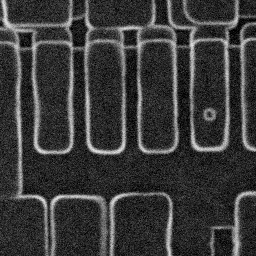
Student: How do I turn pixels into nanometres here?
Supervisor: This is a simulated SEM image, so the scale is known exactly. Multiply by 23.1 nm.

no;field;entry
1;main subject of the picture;wiring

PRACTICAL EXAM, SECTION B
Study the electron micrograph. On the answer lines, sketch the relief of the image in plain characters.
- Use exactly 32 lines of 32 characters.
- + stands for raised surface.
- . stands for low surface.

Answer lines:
+++++++++..............+++++++..
.++++++++..............+++++++..
.++++++++...............++++++..
................................
................................
++...++++..++++...++++..++++..++
++..+++++..++++..+++++..++++..++
++..+++++..++++..+++++..++++..++
++..+++++..++++..+++++..++++..++
++..+++++..++++..+++++..++++..++
++..+++++..++++..+++++..++++..++
++..+++++..++++..+++++..++++..++
++...++++..++++..+++++..++++..++
++...++++..++++..+++++..++++..++
++...++++..++++..+++++..++.+..++
++...++++..++++..+++++..++++..++
++...++++..++++..+++++..++++..++
+++..++++..++++..+++++..++++...+
+++..++++..++++...++++...+++...+
+++.............................
+++.............................
+++.............................
+++.............................
+++.............................
+++............++++++.........++
++++++.++++++.+++++++.........++
+++++++++++++.+++++++.........++
++++++.++++++.+++++++.........++
++++++.++++++.+++++++.........++
++++++.++++++.+++++++.........++
++++++.++++++.+++++++.........++
++++++.++++++.+++++++.........++